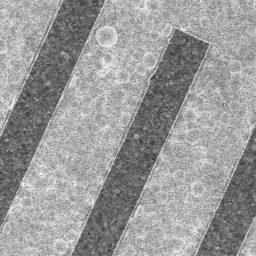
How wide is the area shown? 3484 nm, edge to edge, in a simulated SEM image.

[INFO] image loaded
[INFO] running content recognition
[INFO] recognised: one or a few lines or trenches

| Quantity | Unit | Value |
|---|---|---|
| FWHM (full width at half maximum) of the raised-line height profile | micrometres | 0.536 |